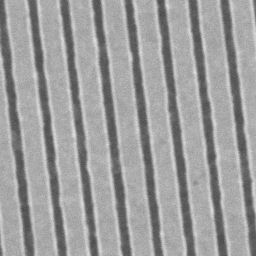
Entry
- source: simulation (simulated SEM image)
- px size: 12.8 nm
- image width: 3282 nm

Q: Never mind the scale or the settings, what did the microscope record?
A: parallel lines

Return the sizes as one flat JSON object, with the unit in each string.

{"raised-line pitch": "409 nm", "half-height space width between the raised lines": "0.154 µm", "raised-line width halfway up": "255 nm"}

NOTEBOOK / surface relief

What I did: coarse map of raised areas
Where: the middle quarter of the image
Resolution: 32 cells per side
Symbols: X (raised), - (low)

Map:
---XXXXX----XXXXX---XXXXX---XXXX
X--XXXXX----XXXXX---XXXXX---XXXX
X---XXXXX---XXXXX---XXXXX---XXXX
X---XXXXX---XXXXX---XXXXX---XXXX
X---XXXXX---XXXXX---XXXXX---XXXX
X---XXXXX---XXXXX---XXXXX---XXXX
X---XXXXX---XXXXX---XXXXXX--XXXX
X---XXXXX----XXXX----XXXXX--XXXX
X---XXXXX---XXXXX----XXXXX--XXXX
XX---XXXXX---XXXXX---XXXXX---XXX
XX---XXXXX---XXXXX---XXXXX---XXX
XX---XXXXX---XXXXX---XXXXX---XXX
XX---XXXXX---XXXXX---XXXXX---XXX
XX---XXXXX---XXXXX---XXXXX---XXX
XX---XXXXX---XXXXX---XXXXX---XXX
XX---XXXXX---XXXXX---XXXXX---XXX
XX----XXXX----XXXX----XXXX----XX
XXX---XXXXX---XXXXX---XXXXX---XX
XXX---XXXXX---XXXXX---XXXXX---XX
XXX---XXXXX---XXXXX---XXXXX---XX
XXX---XXXXX---XXXXX---XXXXX---XX
XXX---XXXXX---XXXXX---XXXXX---XX
XXX---XXXXX---XXXXX---XXXXX---XX
XXX---XXXXX---XXXXX----XXXX---XX
XXX---XXXXX---XXXXXX---XXXX----X
XXX---XXXXX----XXXXX---XXXX----X
XXXX--XXXXX----XXXXX---XXXXX---X
XXXX---XXXXX---XXXXX---XXXXX---X
XXXX---XXXXX---XXXXX---XXXXX---X
XXXX---XXXXX---XXXXX---XXXXX---X
XXXX---XXXXX---XXXXX---XXXXX---X
XXXX---XXXXX----XXXX---XXXXX---X